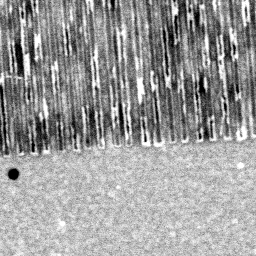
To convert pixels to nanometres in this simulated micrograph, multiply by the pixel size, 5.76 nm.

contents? parallel lines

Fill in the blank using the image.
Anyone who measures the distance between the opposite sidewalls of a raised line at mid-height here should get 35.1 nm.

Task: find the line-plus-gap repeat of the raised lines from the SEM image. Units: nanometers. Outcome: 79.6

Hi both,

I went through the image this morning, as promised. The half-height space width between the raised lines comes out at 7.59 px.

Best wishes